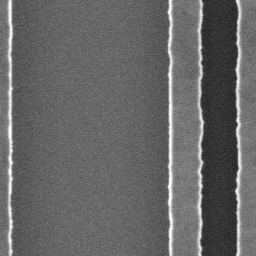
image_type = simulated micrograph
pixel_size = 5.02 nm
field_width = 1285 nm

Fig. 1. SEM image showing lines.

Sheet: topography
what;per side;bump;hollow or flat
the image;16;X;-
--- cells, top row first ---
X----------XX--X
X----------XX--X
X----------XX--X
X----------XX--X
X----------XX--X
X----------XX--X
X----------XX--X
X----------XX--X
X----------XX--X
X----------XX--X
X----------XX--X
X----------XX--X
X----------XX--X
X----------XX--X
X----------XX--X
X----------XX--X